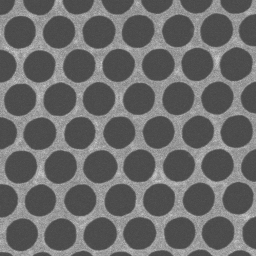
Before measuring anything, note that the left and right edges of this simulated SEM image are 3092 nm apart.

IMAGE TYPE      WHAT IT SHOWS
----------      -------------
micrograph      a regular array of holes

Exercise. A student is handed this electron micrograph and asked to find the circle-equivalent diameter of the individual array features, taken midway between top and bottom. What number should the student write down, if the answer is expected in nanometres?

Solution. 393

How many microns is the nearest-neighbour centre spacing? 0.467